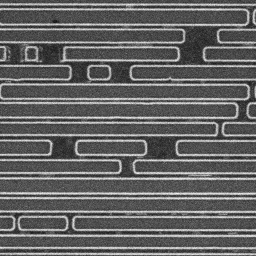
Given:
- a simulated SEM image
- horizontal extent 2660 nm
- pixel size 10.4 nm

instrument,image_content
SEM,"parallel lines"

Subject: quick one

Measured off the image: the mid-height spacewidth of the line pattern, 13.3 px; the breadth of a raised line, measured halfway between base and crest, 58.4 nm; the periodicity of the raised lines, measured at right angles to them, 195 nanometers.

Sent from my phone